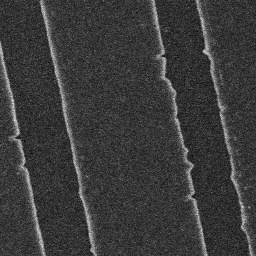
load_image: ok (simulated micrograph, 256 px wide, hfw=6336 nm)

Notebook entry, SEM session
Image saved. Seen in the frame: one or a few lines or trenches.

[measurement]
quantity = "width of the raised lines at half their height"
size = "2710 nm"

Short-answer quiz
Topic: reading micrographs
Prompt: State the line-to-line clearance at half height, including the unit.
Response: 1140 nanometres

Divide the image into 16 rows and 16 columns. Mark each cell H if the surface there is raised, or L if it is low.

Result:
LLLHHHHHHHLLHHHH
LLLHHHHHHHLLLHHH
LLLHHHHHHHLLLHHH
LLLHHHHHHHLLLHHH
LLLLHHHHHHLLLHHH
HLLLHHHHHHHLLHHH
HLLLHHHHHHHLLLHH
HLLLHHHHHHHLLLHH
HLLLHHHHHHHLLLHH
HLLLLHHHHHHHLLHH
HHLLLHHHHHHHLLLH
HHLLLHHHHHHHLLLH
HHLLLHHHHHHHLLLH
HHLLLHHHHHHHLLLH
HHLLLLHHHHHHHLLH
HHHLLLHHHHHHHLLL